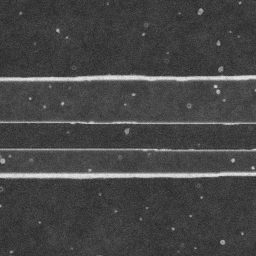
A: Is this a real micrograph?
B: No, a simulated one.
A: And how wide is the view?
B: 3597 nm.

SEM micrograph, lines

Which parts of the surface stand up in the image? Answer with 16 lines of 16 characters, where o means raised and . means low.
................
................
................
................
................
oooooooooooooooo
oooooooooooooooo
oooooooooooooooo
oooooooooooooooo
oooooooooooooooo
oooooooooooooooo
................
................
................
................
................